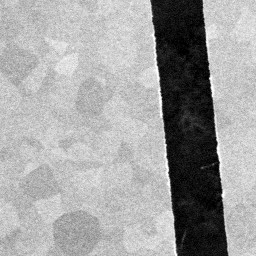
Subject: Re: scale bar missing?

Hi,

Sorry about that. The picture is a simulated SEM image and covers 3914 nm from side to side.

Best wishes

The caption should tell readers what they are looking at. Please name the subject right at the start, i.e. one or a few lines or trenches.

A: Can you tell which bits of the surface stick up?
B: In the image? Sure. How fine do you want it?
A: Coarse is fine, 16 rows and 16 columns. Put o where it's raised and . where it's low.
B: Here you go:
ooooooooo....ooo
oooooooooo...ooo
oooooooooo...ooo
oooooooooo...ooo
oooooooooo...ooo
oooooooooo...ooo
oooooooooo...ooo
oooooooooo...ooo
oooooooooo....oo
oooooooooo....oo
oooooooooo....oo
ooooooooooo...oo
ooooooooooo...oo
ooooooooooo...oo
ooooooooooo...oo
ooooooooooo...oo